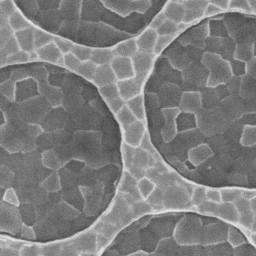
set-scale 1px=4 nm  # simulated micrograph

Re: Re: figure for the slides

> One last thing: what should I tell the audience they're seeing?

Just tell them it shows holes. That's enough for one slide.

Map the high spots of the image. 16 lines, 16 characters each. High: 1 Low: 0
1000000000111111
1100000001110000
1111000011100000
1111111111000000
0000011110000000
0000001110000000
0000000110000000
0000000110000000
0000000010000000
0000000011000000
0000000011100000
0000000111110000
0000000111111111
0000001110000111
0000011100000001
1111111000000000